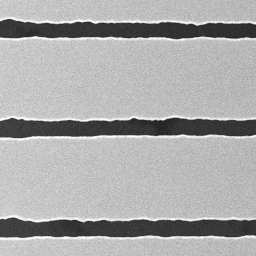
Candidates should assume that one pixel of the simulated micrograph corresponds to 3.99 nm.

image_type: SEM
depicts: lines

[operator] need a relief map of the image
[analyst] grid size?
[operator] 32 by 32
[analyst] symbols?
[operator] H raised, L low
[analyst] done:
HHHHHHHHHHHHHHHHHHHHHHHHHHHHHHHH
HHHHHHHHHHHHHHHHHHHHHHHHHHHHHHHH
LLHHHHHHHHHHHHHHHHHHHHHHHHHHHHHH
LLLLLLLLLLLLLLLLLLLLLLLLLLLLLLLL
LLLLLLLLLLLLLLLLLLLLLLLLLLLLLLLL
HHHHHHHHHHHHHHHHHHHHHHHHHHHHHHHH
HHHHHHHHHHHHHHHHHHHHHHHHHHHHHHHH
HHHHHHHHHHHHHHHHHHHHHHHHHHHHHHHH
HHHHHHHHHHHHHHHHHHHHHHHHHHHHHHHH
HHHHHHHHHHHHHHHHHHHHHHHHHHHHHHHH
HHHHHHHHHHHHHHHHHHHHHHHHHHHHHHHH
HHHHHHHHHHHHHHHHHHHHHHHHHHHHHHHH
HHHHHHHHHHHHHHHHHHHHHHHHHHHHHHHH
HHHHHHHHHHHHHHHHHHHHHHHHHHHHHHHH
HHHHHHHHHHHHHHHHHHHHHHHHHHHHHHHH
LLLLLLLLLLLLLLLLLLLLLLLLLLLLLLLL
LLLLLLLLLLLLLLLLLLLLLLLLLLLLLLLL
HHHHHHHHHHHHHHHHHHHHHHHHHHHHHHHH
HHHHHHHHHHHHHHHHHHHHHHHHHHHHHHHH
HHHHHHHHHHHHHHHHHHHHHHHHHHHHHHHH
HHHHHHHHHHHHHHHHHHHHHHHHHHHHHHHH
HHHHHHHHHHHHHHHHHHHHHHHHHHHHHHHH
HHHHHHHHHHHHHHHHHHHHHHHHHHHHHHHH
HHHHHHHHHHHHHHHHHHHHHHHHHHHHHHHH
HHHHHHHHHHHHHHHHHHHHHHHHHHHHHHHH
HHHHHHHHHHHHHHHHHHHHHHHHHHHHHHHH
HHHHHHHHHHHHHHHHHHHHHHHHHHHHHHHH
LLLHHHHLLLHHHHHHLLLHLLLHHLLLLLLL
LLLLLLLLLLLLLLLLLLLLLLLLLLLLLLLL
LLLLLLLLLLLLHLLLLLHHLLLLLLHLLLHH
HHHHHHHHHHHHHHHHHHHHHHHHHHHHHHHH
HHHHHHHHHHHHHHHHHHHHHHHHHHHHHHHH